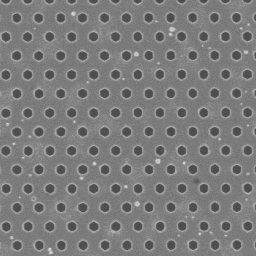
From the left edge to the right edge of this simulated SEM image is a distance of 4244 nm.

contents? a regular array of holes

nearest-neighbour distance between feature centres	360	nanometers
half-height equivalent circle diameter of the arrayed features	0.151	µm